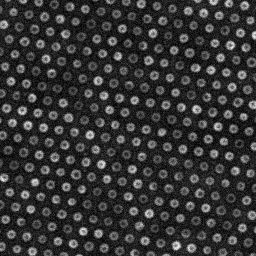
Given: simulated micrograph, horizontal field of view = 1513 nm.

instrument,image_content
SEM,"a regular array of raised bodies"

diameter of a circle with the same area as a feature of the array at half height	0.0467	um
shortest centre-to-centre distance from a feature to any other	91.8	nm